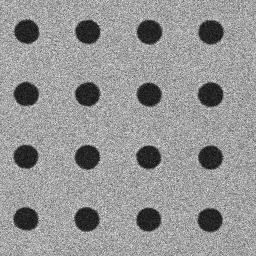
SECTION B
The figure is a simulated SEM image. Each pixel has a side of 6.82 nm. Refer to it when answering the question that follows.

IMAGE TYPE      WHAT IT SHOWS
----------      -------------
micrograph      a regular array of holes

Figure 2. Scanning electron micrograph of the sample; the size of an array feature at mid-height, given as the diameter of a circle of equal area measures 0.169 µm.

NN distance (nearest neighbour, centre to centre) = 0.418 um